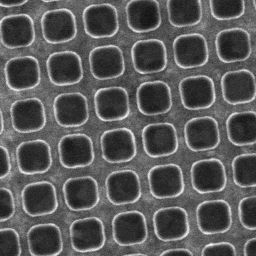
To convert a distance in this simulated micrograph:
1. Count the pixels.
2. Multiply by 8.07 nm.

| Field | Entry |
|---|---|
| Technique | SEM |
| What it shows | a regular array of raised bodies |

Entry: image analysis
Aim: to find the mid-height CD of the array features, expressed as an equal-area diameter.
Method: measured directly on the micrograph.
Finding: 288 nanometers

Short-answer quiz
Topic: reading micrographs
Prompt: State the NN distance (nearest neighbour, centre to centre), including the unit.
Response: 0.338 µm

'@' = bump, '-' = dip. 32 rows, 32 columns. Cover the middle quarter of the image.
@@@@---@@@@@@@@--@@@@@@@@----@@@
@@@@---@@@@@@@@---@@@@@@--------
@@@@@--@@@@@@@------------------
@@@@----@@@@-------------------@
@@@@-------------------@@----@@@
-------------------@@@@@@@---@@@
---------@@@@@@---@@@@@@@@---@@@
@@@@----@@@@@@@@--@@@@@@@@@--@@@
@@@@@---@@@@@@@@--@@@@@@@@@--@@@
@@@@@@--@@@@@@@@--@@@@@@@@@---@@
@@@@@@--@@@@@@@@---@@@@@@@@---@@
@@@@@@--@@@@@@@@---@@@@@@@------
@@@@@@--@@@@@@@@----@@@---------
@@@@@@---@@@@@@-----------------
@@@@@--------------------------@
@@@@-----------------@@@@@@---@@
------------@@@@----@@@@@@@@--@@
----------@@@@@@@---@@@@@@@@--@@
@@@@@@---@@@@@@@@---@@@@@@@@--@@
@@@@@@@--@@@@@@@@---@@@@@@@@---@
@@@@@@@--@@@@@@@@@--@@@@@@@@---@
@@@@@@@---@@@@@@@@--@@@@@@@@----
@@@@@@@---@@@@@@@@---@@@@@@-----
@@@@@@@---@@@@@@@---------------
@@@@@@@----@@@------------------
@@@@@-------------------@@@@----
----------------------@@@@@@@---
------------@@@@@@---@@@@@@@@---
---@@@@----@@@@@@@@--@@@@@@@@---
@@@@@@@@---@@@@@@@@--@@@@@@@@@--
@@@@@@@@---@@@@@@@@---@@@@@@@@--
@@@@@@@@---@@@@@@@@---@@@@@@@@--